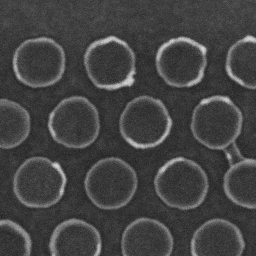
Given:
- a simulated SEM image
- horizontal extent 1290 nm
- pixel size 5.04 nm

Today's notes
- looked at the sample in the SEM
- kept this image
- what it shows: a regular array of raised bodies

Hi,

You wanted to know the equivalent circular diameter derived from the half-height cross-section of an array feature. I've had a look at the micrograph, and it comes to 258 nanometers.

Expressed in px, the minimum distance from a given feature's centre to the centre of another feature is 69.5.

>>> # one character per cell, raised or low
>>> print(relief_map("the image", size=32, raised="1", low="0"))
00000000000000000000000000000000
00000000000000000000000000000000
00000000000000000000000000000000
00000000000000000000000000000000
00000000000000000000000000000000
00011110000011110000011110000111
00111111000111111000111111000111
00111111000111111000111111001111
00111111000111111000111111001111
00111111000111111000111110000111
00011100000011111000011100000011
00000000000000000000000000000000
10000000111000000110000001111000
11100001111100001111100011111100
11110011111100011111100011111100
11110011111100011111100011111100
11110011111100011111100011111100
11100001111100001111000001111000
00000000000000000100000000111100
00000000000000000000000000001100
00011110000011110000011100000111
00111111000111111000111110001111
00111111000111111001111111001111
00111111000111111001111111001111
00111111000111111000111110000111
00011110000011110000011110000011
00000000000000000000000000000000
10000000000000000110000000000000
11100001111100001111100001111100
11110001111100011111100011111100
11110011111110011111110011111100
11110011111100011111100011111100